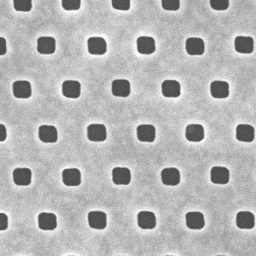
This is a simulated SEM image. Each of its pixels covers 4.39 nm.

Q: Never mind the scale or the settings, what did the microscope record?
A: a regular array of holes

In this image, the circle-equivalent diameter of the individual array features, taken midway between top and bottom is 87.7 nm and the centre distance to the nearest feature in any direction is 215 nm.